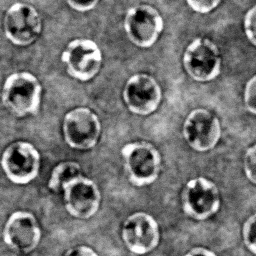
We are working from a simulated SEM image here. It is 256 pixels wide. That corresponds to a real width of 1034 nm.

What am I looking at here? a regular array of raised bodies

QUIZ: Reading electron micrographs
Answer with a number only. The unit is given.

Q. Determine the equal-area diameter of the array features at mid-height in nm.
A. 151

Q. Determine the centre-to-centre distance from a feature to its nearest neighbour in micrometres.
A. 0.278